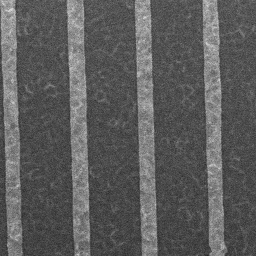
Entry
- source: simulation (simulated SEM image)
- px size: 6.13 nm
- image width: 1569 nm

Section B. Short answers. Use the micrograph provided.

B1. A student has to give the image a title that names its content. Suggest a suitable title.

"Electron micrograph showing one or a few lines or trenches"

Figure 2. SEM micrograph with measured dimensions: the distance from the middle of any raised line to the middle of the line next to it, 0.413 µm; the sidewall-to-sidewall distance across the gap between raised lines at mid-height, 321 nm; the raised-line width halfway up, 0.0904 microns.